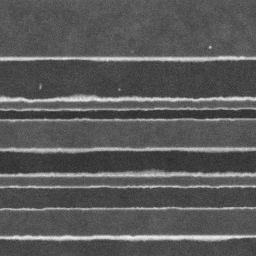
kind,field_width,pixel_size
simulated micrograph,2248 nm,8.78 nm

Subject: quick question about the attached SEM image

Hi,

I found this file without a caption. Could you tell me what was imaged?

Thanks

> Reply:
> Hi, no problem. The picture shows lines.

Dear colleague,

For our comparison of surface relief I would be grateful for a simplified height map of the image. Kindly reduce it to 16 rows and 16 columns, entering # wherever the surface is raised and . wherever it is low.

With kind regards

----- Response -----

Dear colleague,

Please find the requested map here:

################
################
################
################
................
................
################
################
################
................
................
################
################
################
################
................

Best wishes